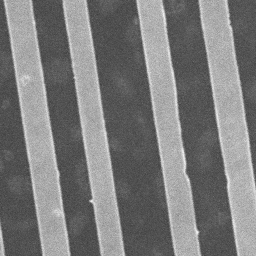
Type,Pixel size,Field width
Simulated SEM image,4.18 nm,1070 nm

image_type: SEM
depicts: one or a few lines or trenches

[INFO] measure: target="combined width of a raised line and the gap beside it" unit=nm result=269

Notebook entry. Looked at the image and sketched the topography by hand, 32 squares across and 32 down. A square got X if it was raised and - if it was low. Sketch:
-XXX----XXX------XXX-----XXX----
-XXX----XXX------XXX-----XXXX---
-XXX----XXX------XXXX----XXXX---
-XXX----XXX-------XXX----XXXX---
-XXXX----XX-------XXX-----XXX---
-XXXX----XXX------XXX-----XXX---
--XXX----XXX------XXX-----XXX---
--XXX----XXX------XXX-----XXX---
--XXX----XXX------XXXX----XXXX--
--XXX----XXX-------XXX----XXXX--
--XXX----XXX-------XXX----XXXX--
--XXXX----XX-------XXX-----XXX--
--XXXX----XXX------XXX-----XXX--
---XXX----XXX------XXX-----XXXX-
---XXX----XXX------XXX-----XXXX-
---XXX----XXX------XXX-----XXXX-
---XXX----XXX-------XX-----XXXX-
---XXXX---XXX-------XXX----XXXX-
---XXXX----XX-------XXX-----XXX-
----XXX----XXX------XXX-----XXX-
----XXX----XXX------XXX-----XXX-
----XXX----XXX------XXX-----XXXX
----XXX----XXX------XXXX----XXXX
----XXXX---XXX-------XXX-----XXX
----XXXX----XX-------XXX-----XXX
----XXXX----XXX------XXX-----XXX
-----XXX----XXX------XXX-----XXX
-----XXX----XXX------XXX-----XXX
-----XXX----XXX------XXX-----XXX
-----XXX----XXX-------XXX----XXX
-----XXXX---XXX-------XXX-----XX
-----XXXX----XX-------XXX-----XX